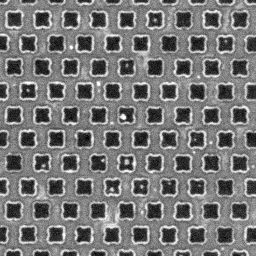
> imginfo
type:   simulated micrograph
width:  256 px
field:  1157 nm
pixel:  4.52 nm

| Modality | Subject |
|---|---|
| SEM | a regular array of raised bodies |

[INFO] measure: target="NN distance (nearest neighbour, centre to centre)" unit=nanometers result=123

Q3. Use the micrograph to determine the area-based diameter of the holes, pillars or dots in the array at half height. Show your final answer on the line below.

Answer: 84.7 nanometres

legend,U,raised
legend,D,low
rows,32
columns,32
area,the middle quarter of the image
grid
UUUUDDDUUUUDDDUUUUDDDUUUUDDDUUUU
UUUUDDDUUUUDDDUUUUDDDUUUUDDDUUUU
UUUDDDDUUUUDDDUUUUDDDUUUUDDDUUUU
DDDDDDDDDDDDDDDDDDDDDDDDDDDDDDDD
DDDDDDDDDDDDDDDDDDDDDDDDDDDDDDDD
DDDUUUUDDDUUUUDDDUUUUDDDUUUUDDDD
DDDUUUUDDDUUUUDDDUUUUDDDUUUUDDDD
DDDUUUUDDDUUUUDDDUUUUDDDUUUUDDDU
DDDUUUUDDDUUUUDDDUUUUDDDUUUUDDDU
DDDDDDDDDDDDDDDDDDDDDDDDDDDDDDDD
DDDDDDDDDDDDDDDDDDDDDDDDDDDDDDDD
UUUUDDDUUUUDDDUUUUDDDUUUUDDDUUUU
UUUUDDDUUUUDDDUUUUDDDUUUUDDDUUUU
UUUUDDDUUUUDDDUUUUDDDUUUUDDDUUUU
UUUUDDDUUUUDDDUUUDDDDUUUUDDDUUUU
DDDDDDDDDDDDDDDDDDDDDDDDDDDDDDDD
DDDDDDDDDDDDDDDDDDDDDDDDDDDDDDDD
DDDUUUUDDDUUUUDDDUUUUDDDUUUUDDDU
DDDUUUUDDDUUUUDDDUUUUDDDUUUUDDDU
DDDUUUUDDDUUUUDDDUUUUDDDUUUUDDDU
DDDUUUUDDDUUUUDDDUUUUDDDUUUUDDDU
DDDDDDDDDDDDDDDDDDDDDDDDDDDDDDDD
DDDDDDDDDDDDDDDDDDDDDDDDDDDDDDDD
UUUUDDDUUUUDDDUUUUDDDUUUUDDDUUUU
UUUUDDDUUUUDDDUUUUDDDUUUUDDDUUUU
UUUUDDDUUUUDDDUUUUDDDUUUUDDDUUUU
UUUUDDDUUUUDDDUUUUDDDUUUDDDDUUUU
DDDDDDDDDDDDDDDDDDDDDDDDDDDDDDDD
DDDDDDDDDDDDDDDDDDDDDDDDDDDDDDDD
DDDUUUUDDDUUUUDDDUUUUDDDUUUUDDDU
DDDUUUUDDDUUUUDDDUUUUDDDUUUUDDDU
DDDUUUUDDDUUUUDDDUUUUDDDUUUUDDDU